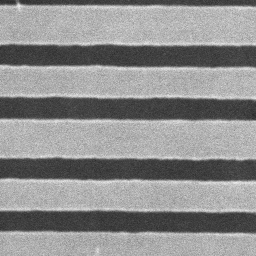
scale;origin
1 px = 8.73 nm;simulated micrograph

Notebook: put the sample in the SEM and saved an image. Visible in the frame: lines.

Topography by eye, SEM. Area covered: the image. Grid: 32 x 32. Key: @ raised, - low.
--------------------------------
@@@@@@@@@@@@@@@@@@@@@@@@@@@@@@@@
@@@@@@@@@@@@@@@@@@@@@@@@@@@@@@@@
@@@@@@@@@@@@@@@@@@@@@@@@@@@@@@@@
@@@@@@@@@@@@@@@@@@@@@@@@@@@@@@@@
@-@@@@@@@@@@@@@@@@@@@@@@@@@@@@@@
--------------------------------
--------------------------------
@@@@@@@@@@@@@@@@@@@@@@@@@@-@@@@@
@@@@@@@@@@@@@@@@@@@@@@@@@@@@@@@@
@@@@@@@@@@@@@@@@@@@@@@@@@@@@@@@@
@@@@@@@@@@@@@@@@@@@@@@@@@@@@@@@@
--------------------------------
--------------------------------
--------------------------------
@@@@@@@@@@@@@@@@@@@@@@@@@@@@@@@@
@@@@@@@@@@@@@@@@@@@@@@@@@@@@@@@@
@@@@@@@@@@@@@@@@@@@@@@@@@@@@@@@@
@@@@@@@@@@@@@@@@@@@@@@@@@@@@@@@@
@@@@@@@@@@@@@@@@@@@@@@@@@@@@@@@@
--------------------------------
--------------------------------
@@@@@@@@@@----@@@@--------------
@@@@@@@@@@@@@@@@@@@@@@@@@@@@@@@@
@@@@@@@@@@@@@@@@@@@@@@@@@@@@@@@@
@@@@@@@@@@@@@@@@@@@@@@@@@@@@@@@@
-------------------------@@@--@@
--------------------------------
--------------------------------
@@@@@@@@@@@@@@@@@@@@@@@@@@@@@@@@
@@@@@@@@@@@@@@@@@@@@@@@@@@@@@@@@
@@@@@@@@@@@@@@@@@@@@@@@@@@@@@@@@